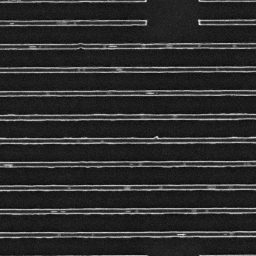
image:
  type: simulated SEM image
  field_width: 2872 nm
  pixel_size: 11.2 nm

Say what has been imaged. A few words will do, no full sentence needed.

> parallel lines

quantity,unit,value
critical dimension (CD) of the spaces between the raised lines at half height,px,18.9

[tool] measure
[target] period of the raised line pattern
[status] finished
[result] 264 nanometres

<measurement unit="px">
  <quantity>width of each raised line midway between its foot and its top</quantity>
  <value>4.5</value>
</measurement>